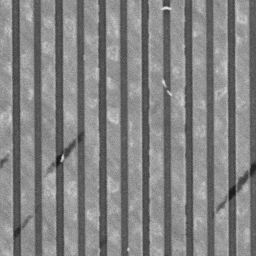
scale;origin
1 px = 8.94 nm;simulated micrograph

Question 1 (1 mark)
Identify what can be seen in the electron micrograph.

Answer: parallel lines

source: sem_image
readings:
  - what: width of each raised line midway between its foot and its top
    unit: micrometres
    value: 0.121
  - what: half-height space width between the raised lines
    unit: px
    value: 7.62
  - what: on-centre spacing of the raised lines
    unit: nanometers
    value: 192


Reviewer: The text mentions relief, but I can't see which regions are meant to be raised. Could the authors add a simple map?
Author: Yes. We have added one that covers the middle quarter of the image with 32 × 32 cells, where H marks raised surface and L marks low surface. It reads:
HHHLLHHHLLLHHHLLHHHLLHHHHLLHHHLL
HHHLLHHHHLLHHHLLHHHLLHHHHLLHHHLL
HHHLLHHHHLLHHHLLHHHLLHHHHLLHHHLL
HHHLLHHHHLLHHHLLHHHLLHHHHLLHHHLL
HHHLLHHHHLLHHHLLHHHLLHHHHLLHHHLL
HHHLLHHHHLLHHHLLHHHLLHHHHLLHHHLL
HHHLLHHHHLLHHHLLHHHLLHHHHLLHHHLL
HHHLLHHHHLLHHHLLHHHLLHHHHLLHHHLL
HHHLLHHHHLLHHHLLHHHLLHHHHLLHHHLL
HHHLLHHHHLLHHHLLHHHLLHHHHLLHHHLL
HHHLLHHHHLLHHHLLHHHLLHHHHLLHHHLL
HHHLLHHHHLLHHHLLHHHLLHHHHLLHHHLL
HHHLLHHHHLLHHHLLHHHLLHHHHLLHHHLL
HHHLLHHHHLLHHHLLHHHLLHHHHLLHHHLL
HHHLLHHHHLLHHHLLHHHLLHHHHLLHHHLL
HHHLLHHHHLLHHHLLHHHLLHHHHLLHHHLL
HHHLLHHHHLLHHHLLHHHLLHHHHLLHHHLL
HHHLLHHHHLLHHHLLHHHLLLHHHLLHHHLL
HHHLLHHHHLLHHHLLHHHLLLHHHLLHHHLL
HHHLLHHHHLLHHHLLHHHLLLHHHLLHHHLL
HHHLLHHHHLLHHHLLHHHLLLHHHLLHHHLL
HHHLLHHHHLLHHHLLHHHLLHHHHLLHHHLL
HHHLLHHHHLLHHHLLHHHLLHHHHLLHHHLL
HHHLLHHHHLLHHHLLHHHLLLHHHLLHHHLL
HHHLLHHHHLLHHHLLHHHLLLHHHLLHHHLL
HHHLLHHHHLLHHHLLHHHLLHHHHLLHHHLL
HHHLLHHHHLLHHHLLHHHLLHHHHLLHHHLL
HHHLLLHHHLLHHHLLHHHLLHHHHLLHHHLL
HHHLLLHHHLLHHHLLHHHLLHHHHLLHHHLL
HHHLLLHHHLLHHHLLHHHLLHHHHLLHHHLL
HHHLLLHHHLLHHHLLHHHLLHHHHLLHHHLL
HHHLLLHHHLLHHHLLHHHLLHHHHLLHHHLL